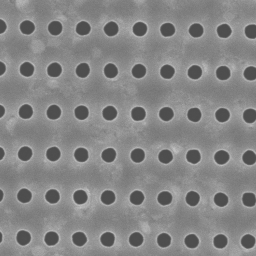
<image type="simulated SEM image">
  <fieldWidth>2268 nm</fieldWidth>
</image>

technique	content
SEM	a regular array of holes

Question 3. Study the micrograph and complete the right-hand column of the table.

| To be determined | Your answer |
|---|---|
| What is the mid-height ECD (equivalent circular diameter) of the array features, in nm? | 128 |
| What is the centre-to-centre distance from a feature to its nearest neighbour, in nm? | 246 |